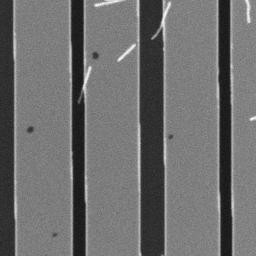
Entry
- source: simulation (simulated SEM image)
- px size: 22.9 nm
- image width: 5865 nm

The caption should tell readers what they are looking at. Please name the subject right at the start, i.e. lines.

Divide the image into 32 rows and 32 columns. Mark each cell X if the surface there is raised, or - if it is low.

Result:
--XXXXXXX--XXXXXX---XXXXXXX--XXX
--XXXXXXX--XXXXXX---XXXXXXX--XXX
--XXXXXXX--XXXXXX---XXXXXXX--XXX
--XXXXXXX--XXXXXX---XXXXXXX--XXX
--XXXXXXX--XXXXXX---XXXXXXX--XXX
--XXXXXXX--XXXXXX----XXXXXX--XXX
--XXXXXXX--XXXXXX----XXXXXX--XXX
--XXXXXXX--XXXXXX----XXXXXX--XXX
--XXXXXXX--XXXXXX----XXXXXX--XXX
--XXXXXXX--XXXXXX----XXXXXX--XXX
--XXXXXXX-XXXXXXX----XXXXXX--XXX
--XXXXXXX-XXXXXXX----XXXXXX--XXX
--XXXXXXX--XXXXXX----XXXXXX--XXX
--XXXXXXX--XXXXXX----XXXXXX--XXX
--XXXXXXX--XXXXXX----XXXXXX--XXX
--XXXXXXX--XXXXXX----XXXXXX--XXX
--XXXXXXX--XXXXXX----XXXXXX--XXX
--XXXXXXX--XXXXXX----XXXXXX--XXX
--XXXXXXX--XXXXXX----XXXXXX--XXX
--XXXXXXX--XXXXXX----XXXXXX--XXX
--XXXXXXX--XXXXXX----XXXXXX--XXX
--XXXXXXX--XXXXXX----XXXXXX--XXX
--XXXXXXX--XXXXXX----XXXXXX--XXX
--XXXXXXX--XXXXXX----XXXXXX--XXX
--XXXXXXX--XXXXXX----XXXXXX--XXX
--XXXXXXX--XXXXXX----XXXXXX--XXX
--XXXXXXX--XXXXXX----XXXXXX--XXX
--XXXXXXX--XXXXXX----XXXXXX--XXX
--XXXXXXX--XXXXXX----XXXXXX--XXX
--XXXXXXX--XXXXXX----XXXXXX--XXX
--XXXXXXX--XXXXXX----XXXXXX--XXX
--XXXXXXX--XXXXXXX---XXXXXX--XXX